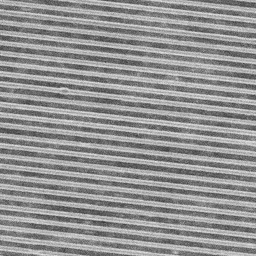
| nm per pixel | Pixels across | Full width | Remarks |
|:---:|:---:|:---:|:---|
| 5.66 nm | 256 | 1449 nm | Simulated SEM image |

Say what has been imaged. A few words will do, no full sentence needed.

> parallel lines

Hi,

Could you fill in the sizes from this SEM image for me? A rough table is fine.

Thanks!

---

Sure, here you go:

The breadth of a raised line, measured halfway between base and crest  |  22.1 nm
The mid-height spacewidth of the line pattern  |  33 nanometres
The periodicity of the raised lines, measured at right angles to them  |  57.6 nanometres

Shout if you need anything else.